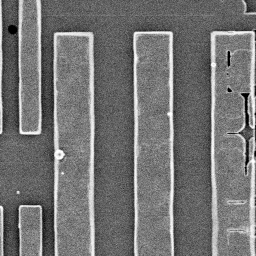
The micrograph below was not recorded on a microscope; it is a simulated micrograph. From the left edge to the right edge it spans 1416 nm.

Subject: wiring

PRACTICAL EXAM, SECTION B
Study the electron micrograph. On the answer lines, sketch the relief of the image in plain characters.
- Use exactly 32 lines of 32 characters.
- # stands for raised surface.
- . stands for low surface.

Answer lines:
...##...........................
...##...........................
...##...........................
..###...........................
..###..####......####......#####
..###..####......####......#####
..###..####......####......#####
..###..####......####......#####
..###..####......####......#####
..###..####......####......####.
..###..####......####......####.
..###..####......####......####.
..###..####......####......#####
...##..####......####......#####
...##..####......####......#####
...##..#####.....####......#####
...##..#####.....####......###..
.......####......####......####.
.......####......####......#####
.......####......####......####.
.......####......####......#####
.......####......####......#####
.......####......####......#####
.......####......####......#####
.......####......####......#####
.......####......####......####.
..###..####......####......####.
..###..####......####......####.
..###..#####.....####......####.
..###..#####.....####......####.
...##..#####.....#####.....####.
...##..#####.....#####.....#####